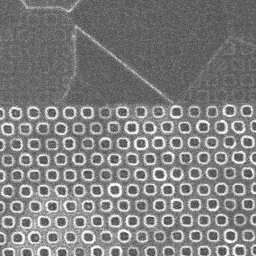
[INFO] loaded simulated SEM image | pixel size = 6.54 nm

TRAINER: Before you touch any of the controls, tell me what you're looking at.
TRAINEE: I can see a regular array of holes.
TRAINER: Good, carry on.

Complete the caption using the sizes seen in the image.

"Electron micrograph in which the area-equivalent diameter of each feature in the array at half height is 63.4 nanometers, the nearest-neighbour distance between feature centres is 114 nm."